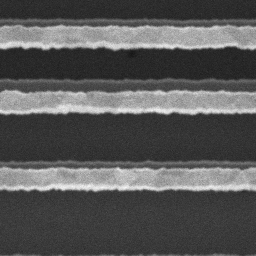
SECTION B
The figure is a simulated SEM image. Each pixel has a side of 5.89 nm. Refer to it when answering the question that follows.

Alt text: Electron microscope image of lines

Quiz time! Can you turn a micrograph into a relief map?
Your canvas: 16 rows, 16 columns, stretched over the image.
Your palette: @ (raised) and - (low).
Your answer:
----------------
@@@@@@@@@@@@@@@@
@@@@@@@@@@@@@@@@
----------------
----------------
@@@@@@@@@@@@@@@@
@@@@@@@@@@@@@@@@
----------------
----------------
----------------
@@@@@@@@@@@@@@@@
@@@@@@@@@@@@@@@@
----------------
----------------
----------------
----------------